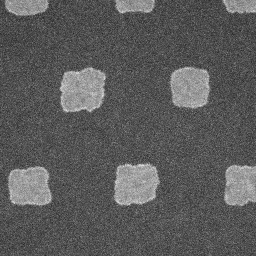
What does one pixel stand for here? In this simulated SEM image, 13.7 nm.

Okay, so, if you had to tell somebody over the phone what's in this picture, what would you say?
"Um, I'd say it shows raised bodies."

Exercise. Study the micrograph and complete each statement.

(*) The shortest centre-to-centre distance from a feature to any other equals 1.47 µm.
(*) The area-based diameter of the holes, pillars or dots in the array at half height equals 0.581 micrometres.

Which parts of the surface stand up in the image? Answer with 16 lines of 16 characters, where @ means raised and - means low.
-@@----@@-----@@
----------------
----------------
----------------
-----@-----@@---
----@@-----@@---
----@@-----@@---
----------------
----------------
----------------
--------@@-----@
-@@----@@@----@@
-@@----@@-----@@
----------------
----------------
----------------